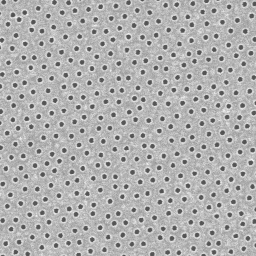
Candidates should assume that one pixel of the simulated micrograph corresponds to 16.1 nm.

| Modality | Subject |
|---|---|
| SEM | a regular array of holes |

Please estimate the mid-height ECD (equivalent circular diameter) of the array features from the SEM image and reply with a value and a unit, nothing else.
5.05 px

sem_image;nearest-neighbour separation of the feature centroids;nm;183